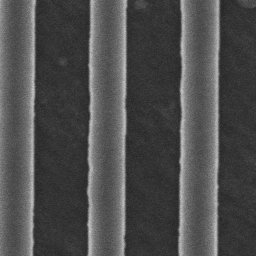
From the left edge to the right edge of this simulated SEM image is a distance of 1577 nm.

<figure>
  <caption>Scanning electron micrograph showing lines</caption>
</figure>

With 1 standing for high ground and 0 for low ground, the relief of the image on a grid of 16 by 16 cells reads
1100001100011100
1100001100011100
1100001100011100
1100001100011100
1100001100011100
1100001100011100
1100001100011100
1100001100011100
1100001100011100
1100001100011100
1100001100011100
1100011100011100
1100001100011100
1100011100011100
1100011100011100
1100001100011100